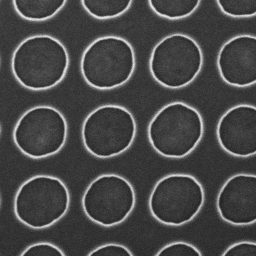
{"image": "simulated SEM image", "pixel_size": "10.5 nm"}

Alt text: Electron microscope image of a regular array of holes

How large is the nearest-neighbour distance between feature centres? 710 nanometers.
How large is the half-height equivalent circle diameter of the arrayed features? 525 nm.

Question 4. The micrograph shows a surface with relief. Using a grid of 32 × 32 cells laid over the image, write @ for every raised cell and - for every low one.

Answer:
@@------@@@-----@@@------@@@----
@@-----@@@@----@@@@@----@@@@----
@@@@@@@@@@@@@@@@@@@@@@@@@@@@@@@@
@@@@@@@@@@@@@@@@@@@@@@@@@@@@@@@@
@@@@@@@@@@@@@@@@@@@@@@-@@@@@@@@@
@@@----@@@@@----@@@@----@@@@----
@@------@@@-----@@@------@@@----
@@------@@-------@@------@@-----
@@------@@-------@@------@@@----
@@------@@@-----@@@-----@@@@----
@@@----@@@@----@@@@@@--@@@@@@--@
@@@@@@@@@@@@@@@@@@@@@@@@@@@@@@@@
@@@@@@@@@@@@@@@@@@@@@@@@@@@@@@@@
@@@@@-@@@@@@@--@@@@@@---@@@@@---
@@@-----@@@-----@@@@-----@@@----
@@------@@@------@@------@@-----
@@------@@-------@@------@@-----
@@------@@@-----@@@------@@@----
@@@----@@@@-----@@@@----@@@@----
@@@@-@@@@@@@@@@@@@@@@@@@@@@@@@@@
@@@@@@@@@@@@@@@@@@@@@@@@@@@@@@@@
@@@@@@@@@@@@@@@@@@@@@@@@@@@@@@@@
@@@@---@@@@@---@@@@@----@@@@@---
@@@-----@@@-----@@@------@@@----
@@------@@@------@@------@@-----
@@------@@@------@@------@@-----
@@------@@@-----@@@------@@@----
@@@----@@@@@---@@@@@---@@@@@----
@@@@@@@@@@@@@@@@@@@@@@@@@@@@@@@@
@@@@@@@@@@@@@@@@@@@@@@@@@@@@@@@@
@@@@@-@@@@@@@@@@@@@@@@-@@@@@@@-@
@@@----@@@@@----@@@@-----@@@----